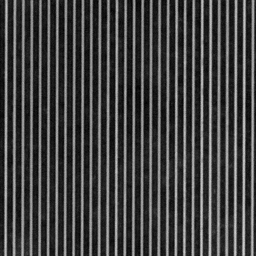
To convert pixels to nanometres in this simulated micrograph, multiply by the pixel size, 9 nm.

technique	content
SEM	parallel lines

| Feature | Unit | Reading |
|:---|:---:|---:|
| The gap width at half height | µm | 0.054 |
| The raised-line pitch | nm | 76.6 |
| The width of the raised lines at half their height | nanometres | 22.5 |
